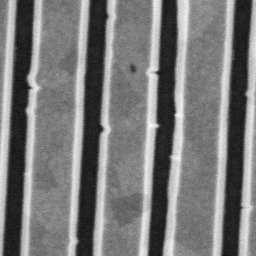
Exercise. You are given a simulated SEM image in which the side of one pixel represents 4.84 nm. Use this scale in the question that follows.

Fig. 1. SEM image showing one or a few lines or trenches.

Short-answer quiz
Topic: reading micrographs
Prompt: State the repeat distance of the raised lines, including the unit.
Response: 0.351 microns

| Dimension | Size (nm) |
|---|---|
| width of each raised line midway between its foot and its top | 226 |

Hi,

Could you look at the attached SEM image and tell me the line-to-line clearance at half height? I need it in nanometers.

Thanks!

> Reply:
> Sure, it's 123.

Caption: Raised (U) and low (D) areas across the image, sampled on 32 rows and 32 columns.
UDDDDUUUUUUDDDUUUUUUDDDUUUUUUDDD
UDDDDUUUUUUDDDUUUUUUDDDUUUUUUDDD
UDDDDUUUUUDDDDUUUUUUDDDUUUUUUDDD
UDDDDUUUUUDDDDUUUUUDDDDUUUUUUDDD
UDDDDUUUUUDDDDUUUUUDDDDUUUUUUDDD
UDDDDUUUUUDDDDUUUUUDDDDUUUUUUDDD
UDDDDUUUUUDDDDUUUUUDDDDUUUUUUDDD
UDDDUUUUUUDDDDUUUUUDDDDUUUUUDDDD
UDDDUUUUUUDDDDUUUUUDDDDUUUUUDDDD
UDDDUUUUUUDDDUUUUUUDDDUUUUUUDDDD
UDDDUUUUUUDDDUUUUUUDDDUUUUUUDDDD
UDDDUUUUUUDDDUUUUUUDDDUUUUUUDDDU
UDDDUUUUUUDDDUUUUUUDDDUUUUUUDDDU
UDDDUUUUUUDDDUUUUUUDDDUUUUUUDDDU
UDDDUUUUUUDDDUUUUUUDDDUUUUUUDDDU
UDDDUUUUUUDDDUUUUUUDDDUUUUUUDDDU
UDDDUUUUUUDDDUUUUUUDDDUUUUUUDDDU
UDDDUUUUUUDDDUUUUUUDDDUUUUUUDDDU
DDDDUUUUUUDDDUUUUUUDDDUUUUUUDDDU
DDDDUUUUUUDDDUUUUUUDDDUUUUUUDDDU
DDDDUUUUUUDDDUUUUUUDDDUUUUUUDDDU
DDDUUUUUUUDDDUUUUUUDDDUUUUUUDDDU
DDDDUUUUUUDDDUUUUUUDDDUUUUUUDDDU
DDDUUUUUUDDDDUUUUUDDDDUUUUUUDDDU
DDDUUUUUUDDDDUUUUUDDDDUUUUUDDDDU
DDDUUUUUUDDDDUUUUUDDDDUUUUUDDDDU
DDDUUUUUUDDDUUUUUUDDDUUUUUUDDDDU
DDDUUUUUUDDDUUUUUUDDDUUUUUUDDDDU
DDDUUUUUUDDDUUUUUUDDDUUUUUUDDDDU
DDDUUUUUUDDDUUUUUUDDDUUUUUUDDDUU
DDDUUUUUUDDDUUUUUUDDDUUUUUUDDDUU
DDDUUUUUUDDDUUUUUUDDDUUUUUUDDDUU